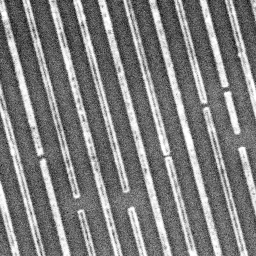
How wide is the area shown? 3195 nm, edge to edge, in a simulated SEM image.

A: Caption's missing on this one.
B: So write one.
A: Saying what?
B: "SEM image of parallel lines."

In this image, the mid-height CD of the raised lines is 57.3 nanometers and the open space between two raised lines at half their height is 20.3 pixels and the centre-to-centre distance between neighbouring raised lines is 0.306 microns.